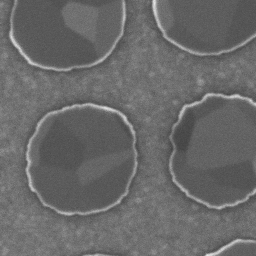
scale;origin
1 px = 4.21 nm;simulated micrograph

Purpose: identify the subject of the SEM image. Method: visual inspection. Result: raised bodies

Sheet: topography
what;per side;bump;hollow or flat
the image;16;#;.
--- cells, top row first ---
.#######..######
.#######..######
.######....#####
.######.........
................
................
............####
...#####...#####
..######...#####
..######...#####
..######...#####
..######...#####
...#####....###.
................
................
..............##